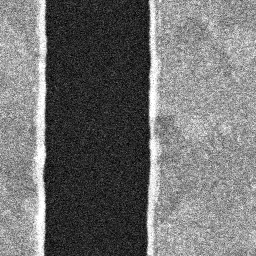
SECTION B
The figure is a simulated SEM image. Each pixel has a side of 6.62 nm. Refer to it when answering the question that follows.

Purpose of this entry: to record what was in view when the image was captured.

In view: one or a few lines or trenches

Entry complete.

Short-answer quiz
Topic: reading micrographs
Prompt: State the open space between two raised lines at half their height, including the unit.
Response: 740 nanometres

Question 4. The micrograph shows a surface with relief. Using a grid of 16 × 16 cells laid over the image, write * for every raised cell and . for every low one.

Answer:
***......*******
***.......******
***.......******
***.......******
***.......******
***.......******
***.......******
**........******
***.......******
***.......******
**........******
***......*******
***......*******
***......*******
***......*******
***......*******